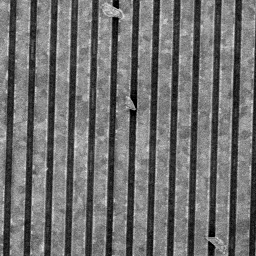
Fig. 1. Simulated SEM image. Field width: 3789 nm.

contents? parallel lines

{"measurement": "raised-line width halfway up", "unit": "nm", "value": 194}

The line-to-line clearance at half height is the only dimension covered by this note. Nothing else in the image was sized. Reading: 111 nanometres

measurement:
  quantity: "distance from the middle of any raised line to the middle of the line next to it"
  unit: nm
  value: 303